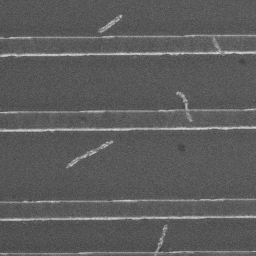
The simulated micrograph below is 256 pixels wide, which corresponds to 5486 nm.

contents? lines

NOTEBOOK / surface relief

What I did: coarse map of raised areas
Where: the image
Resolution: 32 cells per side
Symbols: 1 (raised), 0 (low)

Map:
00000000000000000000000000000000
00000000000000000000000000000000
00000000000000000000000000000000
00000000000000000000000000000000
00000000000000000000000111111111
11111111111111111111111111111111
11111111111111111111111111111111
00000000000000000000000000000000
00000000000000000000000000000000
00000000000000000000000000000000
00000000000000000000000000000000
00000000000000000000000000000000
00000000000000000000000000000000
00000000000000000000000000000000
11111111111111111111111111111111
11111111111111111111111111111111
00000000000000000000000000000000
00000000000000000000000000000000
00000000000000000000000000000000
00000000000000000000000000000000
00000000000000000000000000000000
00000000000000000000000000000000
00000000000000000000000000000000
00000000000000000000000000000000
00000000000000000000000000000000
11111111111111111111111111111111
11111111111111111111111111111111
11110000000000000000000000000000
00000000000000000000000000000000
00000000000000000000000000000000
00000000000000000000000000000000
00000000000000000000000000000000